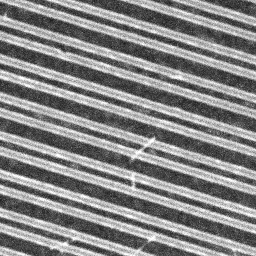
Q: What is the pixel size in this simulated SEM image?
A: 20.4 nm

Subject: parallel lines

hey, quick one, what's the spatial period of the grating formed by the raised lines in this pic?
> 0.373 microns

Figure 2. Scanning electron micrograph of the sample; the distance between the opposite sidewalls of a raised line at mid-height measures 136 nanometers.